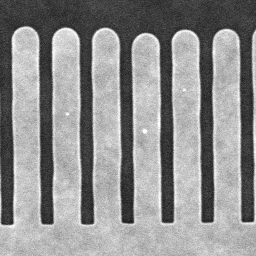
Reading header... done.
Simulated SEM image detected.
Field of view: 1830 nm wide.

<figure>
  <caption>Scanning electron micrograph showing groups of lines, slits or small figures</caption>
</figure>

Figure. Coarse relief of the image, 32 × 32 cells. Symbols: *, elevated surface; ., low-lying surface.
................................
................................
................................
...*............................
..***..***..***..**...**...***..
..***..***..***..***..***..***..
..***..***..***..***..***..***..
..***..***..***..***..***..***..
..***..***..***..***..***..***..
..***..***..***..***..***..***..
..***..***..***..***..***..***..
..***..***..***..***..***..***..
..***..***..***..***..***..***..
..***..***..***..***..***..***..
..***..***..***..***..***..***..
..***..***..***..***..***..***..
..***..***..***..***..***..***..
..***..***..***..***..***..***..
..***..***..***..***..***..***..
..***..***..***..***..***..***..
..***..***..***..***..***..***..
..***..***..***..***..***..***..
..***..***..***..***..***..***..
..***..***..***..***..***..***..
..***..***..***..***..***..***..
..***..***..***..***..***..***..
..***..***..***..***..***..***..
..***..***..***..***..***..***..
********************************
********************************
********************************
********************************